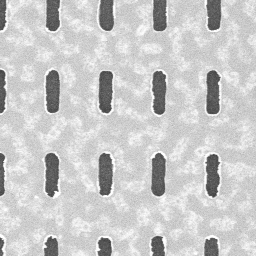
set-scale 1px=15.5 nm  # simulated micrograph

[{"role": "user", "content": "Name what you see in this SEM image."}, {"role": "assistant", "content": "a regular array of holes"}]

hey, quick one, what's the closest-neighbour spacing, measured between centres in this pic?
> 826 nanometers